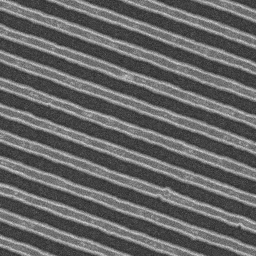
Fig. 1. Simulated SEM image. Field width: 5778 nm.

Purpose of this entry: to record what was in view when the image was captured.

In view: parallel lines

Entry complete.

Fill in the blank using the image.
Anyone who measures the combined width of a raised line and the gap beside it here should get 0.561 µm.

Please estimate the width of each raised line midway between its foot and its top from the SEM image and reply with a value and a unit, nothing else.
0.236 µm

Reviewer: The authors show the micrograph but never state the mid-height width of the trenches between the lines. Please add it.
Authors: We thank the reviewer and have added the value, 335 nanometres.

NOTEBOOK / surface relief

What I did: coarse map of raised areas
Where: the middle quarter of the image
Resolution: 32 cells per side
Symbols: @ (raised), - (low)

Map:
-----@@@@@@@@-----------@@@@@@@@
---------@@@@@@-----------@@@@@@
-----------@@@@@@@-----------@@@
@@@-----------@@@@@@@-----------
@@@@@@----------@@@@@@@@@-------
-@@@@@@@@-----------@@@@@@@-----
---@@@@@@@@-----------@@@@@@@@--
-------@@@@@@@-----------@@@@@@@
----------@@@@@@@-----------@@@@
@-----------@@@@@@@@----------@@
@@@------------@@@@@@@----------
@@@@@@------------@@@@@@@-------
--@@@@@@@------------@@@@@@@----
-----@@@@@@@-----------@@@@@@@@-
-------@@@@@@@@-----------@@@@@@
----------@@@@@@@-----------@@@@
@@-----------@@@@@@@@-----------
@@@@@-----------@@@@@@@@--------
-@@@@@@------------@@@@@@@------
---@@@@@@@-----------@@@@@@@@@--
------@@@@@@@------------@@@@@@@
---------@@@@@@@-----------@@@@@
@-----------@@@@@@@-----------@@
@@@@----------@@@@@@@@----------
@@@@@@-----------@@@@@@@--------
--@@@@@@@-----------@@@@@@@-----
----@@@@@@@-----------@@@@@@@@--
-------@@@@@@@------------@@@@@@
----------@@@@@@@-----------@@@@
@------------@@@@@@@-----------@
@@@@-----------@@@@@@@----------
@@@@@@@-----------@@@@@@@@@-----